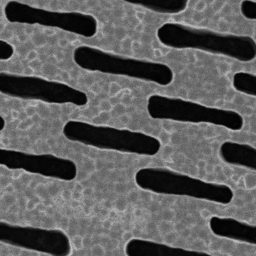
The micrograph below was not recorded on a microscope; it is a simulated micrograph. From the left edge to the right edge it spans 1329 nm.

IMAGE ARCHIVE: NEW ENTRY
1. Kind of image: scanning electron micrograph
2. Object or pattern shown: holes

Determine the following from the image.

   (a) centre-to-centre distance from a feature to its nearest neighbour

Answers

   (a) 382 nm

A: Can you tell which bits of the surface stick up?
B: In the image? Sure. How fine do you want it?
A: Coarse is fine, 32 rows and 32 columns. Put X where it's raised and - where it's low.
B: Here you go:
X--XXXXXXXXXXXXXXX-----XXXXXXX--
X------XXXXXXXXXXXXX--XXXXXXXX--
X-----------XXXXXXXXXXXXXXXXXXXX
XXXXXXXX----XXXXXXXX---XXXXXXXXX
XXXXXXXXXXXXXXXXXXXX-------XXXXX
-XXXXXXXXXXXXXXXXXXXX-----------
--XXXXXXX----XXXXXXXXXXXXXX-----
XXXXXXXXX--------XXXXXXXXXXXXX-X
XXXXXXXXXX-----------XXXXXXXXXXX
-XXXXXXXXXXXXXXX-----XXXXXXXX---
--------XXXXXXXXXXXX-XXXXXXXX---
----------XXXXXXXXXXXXXXXXXXXX--
XXXXX------XXXXXXXX----XXXXXXXXX
XXXXXXXXXXXXXXXXXX---------XXXXX
XXXXXXXXXXXXXXXXXXX-----------XX
XXXXXXXX---XXXXXXXXXXXXXXXX---XX
XXXXXXXX---------XXXXXXXXXXXXXXX
XXXXXXXXX-----------XXXXXXXXXXXX
XXXXXXXXXXXXX-------XXXXXXXX----
-------XXXXXXXXXXXXXXXXXXXXX----
---------XXXXXXXXXXXXXXXXXXXXX--
XXXX------XXXXXXX----XXXXXXXXXXX
XXXXXXXXXXXXXXXXX--------XXXXXXX
XXXXXXXXXXXXXXXXXX-----------XXX
XXXXXXXXXXXXXXXXXXXXXXXX-----XXX
XXXXXXXXXXXXXXXXXXXXXXXXXXXXXXXX
XXXXXXXXXXXXXXXXXXXXXXXXXXXXXXXX
XXXXXXXXXXXXXXXXXXXXXXXXXX---XXX
----XXXXXXXXXXXXXXXXXXXXXX------
--------XXXXXXXXXXXXXXXXXXXX----
XX-------XXXXXXX----XXXXXXXXXXXX
XXXXX----XXXXXXX--------XXXXXXXX